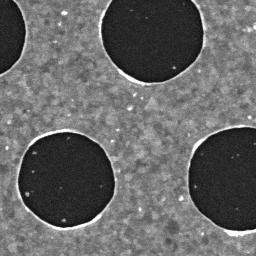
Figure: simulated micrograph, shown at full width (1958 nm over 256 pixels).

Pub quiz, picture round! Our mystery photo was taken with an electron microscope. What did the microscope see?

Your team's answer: holes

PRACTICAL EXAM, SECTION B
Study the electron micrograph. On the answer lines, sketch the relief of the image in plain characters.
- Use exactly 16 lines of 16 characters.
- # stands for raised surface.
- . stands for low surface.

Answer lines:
.######.....####
..####.......###
..####.......###
.######.....####
########...#####
################
################
################
###..########...
##.....#####....
#......#####....
#......#####....
#......#####....
##....#######...
################
################